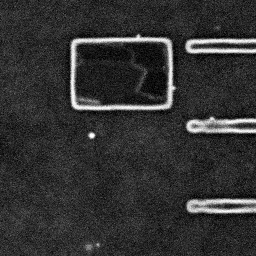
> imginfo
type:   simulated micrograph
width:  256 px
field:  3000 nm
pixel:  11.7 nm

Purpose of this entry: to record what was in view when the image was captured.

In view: wiring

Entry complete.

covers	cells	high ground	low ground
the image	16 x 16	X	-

----------------
----------------
------XXXX------
-----XXXXXX-----
-----XXXXXX-----
-----XXXXXX-----
-----XXXXX------
----------------
----------------
----------------
----------------
----------------
----------------
----------------
----------------
----------------